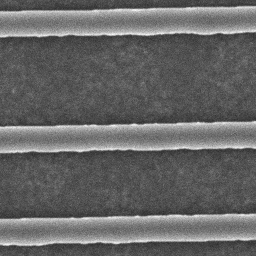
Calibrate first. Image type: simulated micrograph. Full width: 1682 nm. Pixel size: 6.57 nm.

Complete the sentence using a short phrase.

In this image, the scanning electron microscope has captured lines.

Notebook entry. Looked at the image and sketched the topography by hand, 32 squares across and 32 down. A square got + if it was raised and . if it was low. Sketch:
................................
..++++++++++++++++++++++++++++++
++++++++++++++++++++++++++++++++
++++++++++++++++++++++++++++++++
+...............................
................................
................................
................................
................................
................................
................................
................................
................................
................................
................................
......................++++++++++
++++++++++++++++++++++++++++++++
++++++++++++++++++++++++++++++++
++++++++++++++++++++++++++++++++
................................
................................
................................
................................
................................
................................
................................
................................
++++++++++++++++++++++++++++++++
++++++++++++++++++++++++++++++++
++++++++++++++++++++++++++++++++
++++++..........................
................................